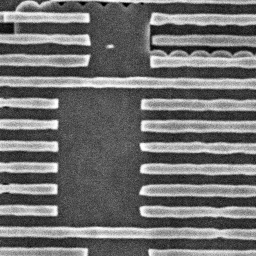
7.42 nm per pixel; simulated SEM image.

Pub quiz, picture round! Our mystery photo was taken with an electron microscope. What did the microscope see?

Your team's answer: wiring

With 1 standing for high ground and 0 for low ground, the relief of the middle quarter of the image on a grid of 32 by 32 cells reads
11000000000000000000001100000000
00000000000000000000000000000000
00000000000000000000000000000000
11100000000000000110000000000000
11111111111111111111111111111111
11110001111111111111111111111111
00000000000000000000000000000000
00000000000000000000000000000000
00000000000000000000000000000000
00000000000000000000111111111111
00000000000000000000111111111111
00000000000000000000000000000000
00000000000000000000000000000000
00000000000000000000000000000000
00000000000000000000111111111111
00000000000000000000111111111111
00000000000000000000001111111111
00000000000000000000000000000000
00000000000000000000000000000000
00000000000000000000000000000000
00000000000000000001111111111111
00000000000000000000011111111111
00000000000000000000000000000000
00000000000000000000000000000000
00000000000000000000000000000000
00000000000000000000111111111111
00000000000000000001111111111111
00000000000000000000000000000000
00000000000000000000000000000000
00000000000000000000000000000000
00000000000000000000011111111111
00000000000000000001111111111111